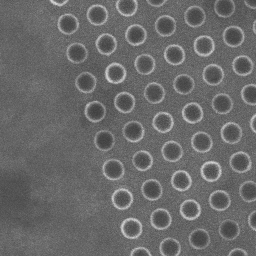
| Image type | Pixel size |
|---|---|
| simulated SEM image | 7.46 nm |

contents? a regular array of raised bodies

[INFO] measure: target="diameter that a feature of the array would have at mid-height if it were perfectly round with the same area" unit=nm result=151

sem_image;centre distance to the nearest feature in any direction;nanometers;227